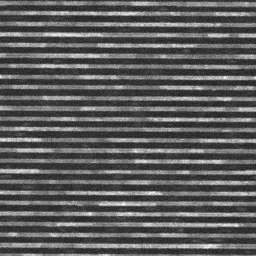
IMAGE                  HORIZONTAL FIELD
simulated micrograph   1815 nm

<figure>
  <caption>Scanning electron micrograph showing parallel lines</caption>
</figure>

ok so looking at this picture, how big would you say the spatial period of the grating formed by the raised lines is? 0.0747 µm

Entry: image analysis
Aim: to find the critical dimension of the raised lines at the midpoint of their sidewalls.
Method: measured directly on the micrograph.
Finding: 23.9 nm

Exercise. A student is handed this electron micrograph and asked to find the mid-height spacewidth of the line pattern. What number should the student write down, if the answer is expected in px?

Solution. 7.49